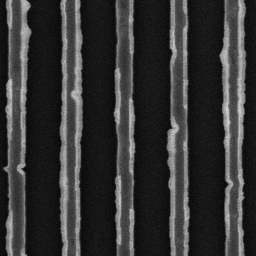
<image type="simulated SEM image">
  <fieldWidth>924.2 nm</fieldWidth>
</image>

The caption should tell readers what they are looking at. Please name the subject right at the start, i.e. parallel lines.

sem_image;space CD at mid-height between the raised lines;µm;0.13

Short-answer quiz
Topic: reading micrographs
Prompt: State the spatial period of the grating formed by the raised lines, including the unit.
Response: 196 nanometers